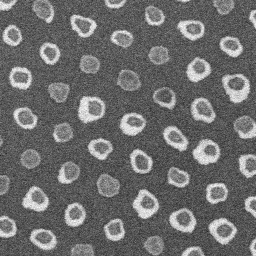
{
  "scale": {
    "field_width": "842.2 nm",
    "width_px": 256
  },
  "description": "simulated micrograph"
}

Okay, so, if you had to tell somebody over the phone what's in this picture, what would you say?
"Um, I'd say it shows a regular array of raised bodies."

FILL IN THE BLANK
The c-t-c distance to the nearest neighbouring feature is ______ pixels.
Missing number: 39.3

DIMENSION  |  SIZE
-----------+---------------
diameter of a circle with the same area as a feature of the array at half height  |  71.6 nm